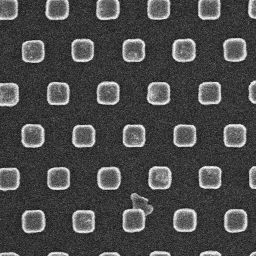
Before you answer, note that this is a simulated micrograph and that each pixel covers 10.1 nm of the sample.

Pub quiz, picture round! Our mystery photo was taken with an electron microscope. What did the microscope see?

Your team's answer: a regular array of raised bodies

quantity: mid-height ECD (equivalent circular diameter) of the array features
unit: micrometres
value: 0.236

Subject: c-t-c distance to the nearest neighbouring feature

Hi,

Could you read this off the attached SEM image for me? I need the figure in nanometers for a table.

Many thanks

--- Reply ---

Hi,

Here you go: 495